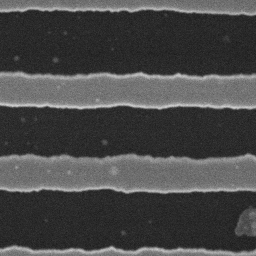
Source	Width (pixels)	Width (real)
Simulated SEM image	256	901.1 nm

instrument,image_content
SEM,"lines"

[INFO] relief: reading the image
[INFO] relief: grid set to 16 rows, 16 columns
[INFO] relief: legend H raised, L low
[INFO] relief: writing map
HHHHHHHHHHHHHHHH
LLLLLLLLLLLLLLLL
LLLLLLLLLLLLLLLL
LLLLLLLLLLLLLLLL
LLLLLLLLLLLLLLLL
HHHHHHHHHHHHHHHH
HHHHHHHHHHHHHHHH
LLLLLLLLLLLLLLLL
LLLLLLLLLLLLLLLL
LLLLLLLLLLLLLLLL
HHHHHHHHHHHHHHHH
HHHHHHHHHHHHHHHH
LLLLLLLLLLLLLLLL
LLLLLLLLLLLLLLLH
LLLLLLLLLLLLLLLH
HLLLLLLLLLLLLLLL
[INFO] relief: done